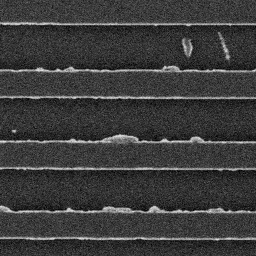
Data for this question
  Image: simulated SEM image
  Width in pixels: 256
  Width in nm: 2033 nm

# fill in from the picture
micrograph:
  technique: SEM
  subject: lines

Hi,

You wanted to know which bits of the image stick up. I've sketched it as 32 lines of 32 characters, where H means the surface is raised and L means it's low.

HHHHHHHHHHHHHHHHHHHHHHHHHHHHHHHH
HHHHHHHHHHHHHHHHHHHHHHHHHHHHHHHH
HHHHHHHHHHHHHHHHHHHHHHHHHHHHHHHH
LLLLLLLLLLLLLLLLLLLLLLLLLLLLLLLL
LLLLLLLLLLLLLLLLLLLLLLLLLLLLLLLL
LLLLLLLLLLLLLLLLLLLLLLLHLLLLLLLL
LLLLLLLLLLLLLLLLLLLLLLLLLLLLLLLL
LLLLLLLLLLLLLLLLLLLLLLLLLLLLLLLL
LLLLLLLLLLLLLLLLLLLLLHLLLLLLLLLL
HHHHHHHHHHHHHHHHHHHHHHHHHHHHHHHH
HHHHHHHHHHHHHHHHHHHHHHHHHHHHHHHH
HHHHHHHHHHHHHHHHHHHHHHHHHHHHHHHH
LLLLLLLLLLLLLLLLLLLLLLLLLLLLLLLL
LLLLLLLLLLLLLLLLLLLLLLLLLLLLLLLL
LLLLLLLLLLLLLLLLLLLLLLLLLLLLLLLL
LLLLLLLLLLLLLLLLLLLLLLLLLLLLLLLL
LLLLLLLLLLLLLLLLLLLLLLLLLLLLLLLL
LLLLLLLLLLLLLHHHHLLLLLLLHLLLLLLL
HHHHHHHHHHHHHHHHHHHHHHHHHHHHHHHH
HHHHHHHHHHHHHHHHHHHHHHHHHHHHHHHH
HHHHHHHHHHHHHHHHHHHHHHHHHHHHHHHH
LLLLLLLLLLLLLLLLLLLLLLLLLLLLLLLL
LLLLLLLLLLLLLLLLLLLLLLLLLLLLLLLL
LLLLLLLLLLLLLLLLLLLLLLLLLLLLLLLL
LLLLLLLLLLLLLLLLLLLLLLLLLLLLLLLL
LLLLLLLLLLLLLLLLLLLLLLLLLLLLLLLL
HHHHHHHHHHHHHHHHHHHHLHHHHHHHHHHH
HHHHHHHHHHHHHHHHHHHHHHHHHHHHHHHH
HHHHHHHHHHHHHHHHHHHHHHHHHHHHHHHH
HHHHHHHHHHHHHHHHHHHHHHHHHHHHHHHH
LLLLLLLLLLLLLLLLLLLLLLLLLLLLLLLL
LLLLLLLLLLLLLLLLLLLLLLLLLLLLLLLL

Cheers